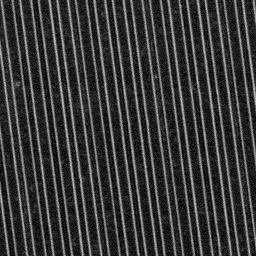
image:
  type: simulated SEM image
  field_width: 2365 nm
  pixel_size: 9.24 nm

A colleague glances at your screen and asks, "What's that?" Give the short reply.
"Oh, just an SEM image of parallel lines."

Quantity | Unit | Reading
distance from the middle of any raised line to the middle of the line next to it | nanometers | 170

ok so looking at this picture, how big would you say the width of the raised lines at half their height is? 0.109 micrometres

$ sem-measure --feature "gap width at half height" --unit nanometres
64.2